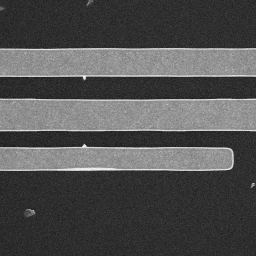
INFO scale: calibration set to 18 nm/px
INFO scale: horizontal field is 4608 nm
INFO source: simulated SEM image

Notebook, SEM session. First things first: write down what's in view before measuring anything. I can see groups of lines, slits or small figures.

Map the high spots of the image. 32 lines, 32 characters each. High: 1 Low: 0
00000000000000000000000000000000
00000000000000000000000000000000
00000000000000000000000000000000
00000000000000000000000000000000
00000000000000000000000000000000
00000000000000000000000000000000
11111111111111111111111111111111
11111111111111111111111111111111
11111111111111111111111111111111
00000000000000000000000000000000
00000000000000000000000000000000
00000000000000000000000000000000
11111100000000000000000001111111
11111111111111111111111111111111
11111111111111111111111111111111
11111111111111111111111111111111
00000000000000000000000000000000
00000000000000000000000000000000
00000000111110000000011000000000
11111111111111111111111111111000
11111111111111111111111111111000
00000000000000000000000000000000
00000000000000000000000000000000
00000000000000000000000000000000
00000000000000000000000000000000
00000000000000000000000000000000
00000000000000000000000000000000
00000000000000000000000000000000
00000000000000000000000000000000
00000000000000000000000000000000
00000000000000000000000000000000
00000000000000000000000000000000